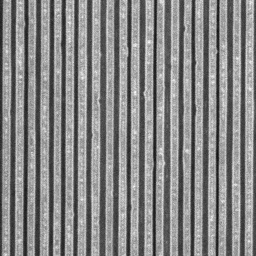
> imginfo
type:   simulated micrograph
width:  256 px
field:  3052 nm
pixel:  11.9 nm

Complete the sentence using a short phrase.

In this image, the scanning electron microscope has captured parallel lines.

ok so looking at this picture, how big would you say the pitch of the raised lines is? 152 nm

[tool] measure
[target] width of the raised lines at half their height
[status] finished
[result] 0.082 um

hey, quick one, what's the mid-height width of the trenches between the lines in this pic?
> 0.07 microns